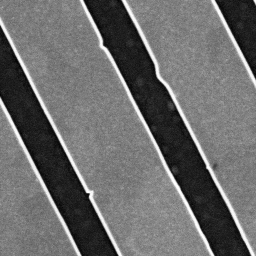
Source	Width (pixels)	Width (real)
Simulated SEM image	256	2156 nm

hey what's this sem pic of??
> one or a few lines or trenches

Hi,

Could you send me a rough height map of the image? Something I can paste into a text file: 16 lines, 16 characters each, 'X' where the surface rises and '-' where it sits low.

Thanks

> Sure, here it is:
XXXXX---XXXXXX--
XXXXXX---XXXXX--
-XXXXX---XXXXXX-
-XXXXXX---XXXXX-
--XXXXX---XXXXXX
--XXXXXX---XXXXX
---XXXXX---XXXXX
X--XXXXXX---XXXX
X---XXXXX---XXXX
XX--XXXXXX---XXX
XX---XXXXX---XXX
XXX--XXXXXX---XX
XXX---XXXXXX--XX
XXXX--XXXXXX---X
XXXX---XXXXXX--X
XXXXX--XXXXXX---